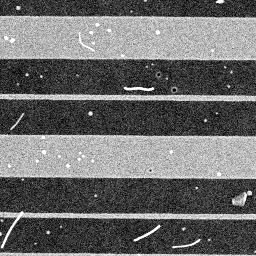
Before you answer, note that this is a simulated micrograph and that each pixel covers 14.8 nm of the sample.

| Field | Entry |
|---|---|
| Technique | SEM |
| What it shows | lines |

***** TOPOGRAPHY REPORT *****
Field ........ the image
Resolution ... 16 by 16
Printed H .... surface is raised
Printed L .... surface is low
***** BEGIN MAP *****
LLLLLLLLLLLLLLLL
HHHHHHHHHHHHHHHH
HHHHHHHHHHHHHHHH
HHHHHHHHHHHHHHHH
LLLLLLLLLLLLLLLL
LLLLLLLLLLLLLLLL
LLLLLLLLLLLLLLLL
LLLLLLLLLLLLLLLL
HHHHHHHLLLLLLLLL
HHHHHHHHHHHHHHHH
HHHHHHHHHHHHHHHH
LLLLLLLLLLLLLLLL
LLLLLLLLLLLLLLLL
LLLLLLLLLLLLLLLL
LLLLLLLLLLLLLLLL
LLLLLLLLLLLLLLLL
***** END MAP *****